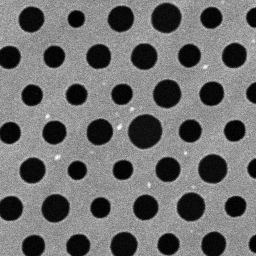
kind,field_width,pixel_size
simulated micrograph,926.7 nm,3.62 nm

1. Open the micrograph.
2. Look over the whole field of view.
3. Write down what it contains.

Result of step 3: a regular array of holes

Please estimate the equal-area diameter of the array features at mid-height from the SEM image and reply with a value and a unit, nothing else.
88.2 nanometres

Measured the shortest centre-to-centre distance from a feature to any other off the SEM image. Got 43.8 px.